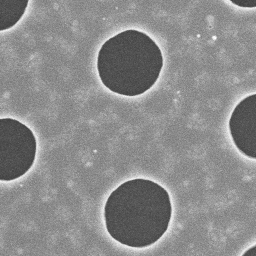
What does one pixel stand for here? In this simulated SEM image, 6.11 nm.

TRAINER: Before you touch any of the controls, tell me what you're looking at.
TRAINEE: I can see holes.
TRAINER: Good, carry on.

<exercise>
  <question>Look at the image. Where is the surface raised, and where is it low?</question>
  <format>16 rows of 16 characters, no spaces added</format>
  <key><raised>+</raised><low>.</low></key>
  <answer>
..++++++++++++++
.+++++++++++++++
+++++++..+++++++
++++++....++++++
++++++....++++++
+++++++..+++++++
+++++++++++++++.
.+++++++++++++..
..++++++++++++..
..+++++++++++++.
..++++++++++++++
++++++++..++++++
+++++++....+++++
+++++++....+++++
+++++++...++++++
++++++++++++++++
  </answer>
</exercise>